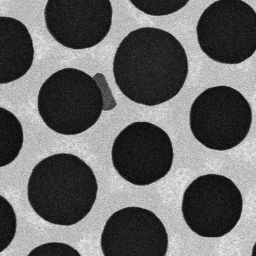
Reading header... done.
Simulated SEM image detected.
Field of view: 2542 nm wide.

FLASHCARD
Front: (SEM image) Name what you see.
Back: holes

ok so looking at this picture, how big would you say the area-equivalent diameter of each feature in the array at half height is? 661 nanometres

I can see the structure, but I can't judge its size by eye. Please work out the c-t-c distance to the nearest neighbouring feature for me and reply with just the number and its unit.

0.852 µm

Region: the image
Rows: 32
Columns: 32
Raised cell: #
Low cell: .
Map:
######........###......###.....#
######........####....###.......
..####........###########.......
...###........####.######.......
....###......###......###.......
....####....###........##.......
....##########.........##.......
....##########.........####....#
....##########.........#########
...###.......#.........#########
#####........##........#########
#####.........#.......###.....##
#####.........##.....###.......#
#####.........##########.......#
..###.......############.......#
...###......####...#####.......#
...####...#####......###.......#
...###########.......####.....##
...###########........####...###
..####...#####........##########
.####......###.......###########
####........###......###########
####........####....####.....###
###.........###########.......##
###.........###########.......##
.###........###########.......##
..##.......###.....####.......##
..####....###.......###.......##
..###########........###.....###
..###########........####...####
.####...#####........###########
####......###........###########